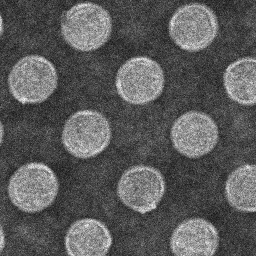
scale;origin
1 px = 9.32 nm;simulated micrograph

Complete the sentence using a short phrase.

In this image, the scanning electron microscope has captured a regular array of raised bodies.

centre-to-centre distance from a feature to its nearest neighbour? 704 nm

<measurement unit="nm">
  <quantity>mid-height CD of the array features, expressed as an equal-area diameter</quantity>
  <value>430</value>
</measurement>